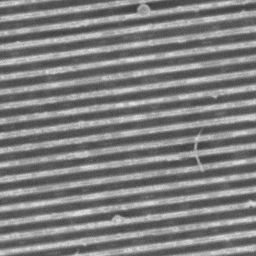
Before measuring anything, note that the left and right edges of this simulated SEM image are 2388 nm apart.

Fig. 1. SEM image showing parallel lines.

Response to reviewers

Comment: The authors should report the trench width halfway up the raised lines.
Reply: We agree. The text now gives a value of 86.7 nanometers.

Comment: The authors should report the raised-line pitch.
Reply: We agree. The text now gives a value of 135 nm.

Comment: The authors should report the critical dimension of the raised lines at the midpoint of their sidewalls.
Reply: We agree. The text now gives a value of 5.46 px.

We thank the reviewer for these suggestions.